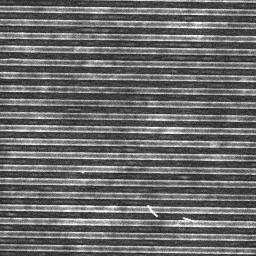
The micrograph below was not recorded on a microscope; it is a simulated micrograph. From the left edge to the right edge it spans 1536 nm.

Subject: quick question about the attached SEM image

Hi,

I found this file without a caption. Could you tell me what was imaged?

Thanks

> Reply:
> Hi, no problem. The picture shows parallel lines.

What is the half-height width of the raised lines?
37.5 nm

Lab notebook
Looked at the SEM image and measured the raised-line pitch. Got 79.5 nanometres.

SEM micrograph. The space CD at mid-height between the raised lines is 0.0428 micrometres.